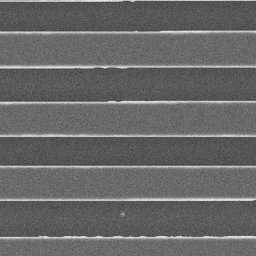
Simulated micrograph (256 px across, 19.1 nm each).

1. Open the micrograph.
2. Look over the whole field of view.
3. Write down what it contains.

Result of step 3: lines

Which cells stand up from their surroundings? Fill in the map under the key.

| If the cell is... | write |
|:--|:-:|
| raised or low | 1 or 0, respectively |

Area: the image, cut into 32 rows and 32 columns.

00000000000000000000000000000000
00000000000000000000000000000000
00000000000000000000000000000000
00000000000000000000000000000000
11111111111111111111111111111111
11111111111111111111111111111111
11111111111111111111111111111111
11111111111111111111111111111111
00000000000000000000000000000000
00000000000000000000000000000000
00000000000000000000000000000000
00000000000000000000000000000000
00000000000000000000000000000000
11111111111111111111111111111111
11111111111111111111111111111111
11111111111111111111111111111111
11111111111111111111111111111111
00000000000000000000000000000000
00000000000000000000000000000000
00000000000000000000000000000000
00000000000000000000000000000000
11111111111111111111111111111111
11111111111111111111111111111111
11111111111111111111111111111111
11111111111111111111111111111111
00000000000000000000000000000000
00000000000000000000000000000000
00000000000000000000000000000000
00000000000000000000000000000000
00000000000000000000000000000000
11111111111111111111111111111111
11111111111111111111111111111111